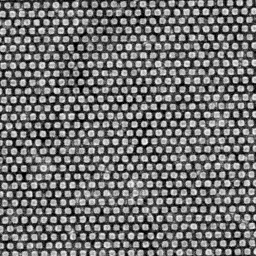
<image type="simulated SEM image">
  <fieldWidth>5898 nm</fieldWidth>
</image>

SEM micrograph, a regular array of raised bodies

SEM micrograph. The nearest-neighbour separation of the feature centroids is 217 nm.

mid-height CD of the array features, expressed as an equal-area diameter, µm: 0.13